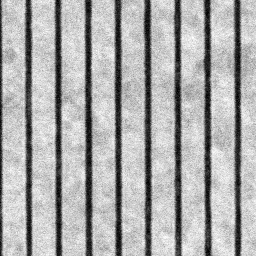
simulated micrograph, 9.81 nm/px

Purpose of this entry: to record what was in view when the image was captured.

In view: parallel lines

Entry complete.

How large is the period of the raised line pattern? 293 nm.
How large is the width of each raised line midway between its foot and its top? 213 nm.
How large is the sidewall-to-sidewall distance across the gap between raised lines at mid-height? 79.7 nm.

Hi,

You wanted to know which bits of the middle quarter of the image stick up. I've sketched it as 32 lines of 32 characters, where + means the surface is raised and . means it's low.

+++++..+++++...+++++..+++++...++
+++++..+++++...+++++..+++++...++
+++++..+++++...+++++..+++++...++
+++++..+++++...+++++..+++++...++
+++++..+++++...+++++..+++++...++
+++++..+++++...+++++..+++++...++
+++++..+++++...+++++..+++++...++
+++++..+++++...+++++..+++++...++
+++++..+++++...+++++..+++++...++
+++++..+++++...+++++..+++++...++
+++++..+++++...+++++..+++++...++
+++++..++++++..+++++..+++++...++
+++++..++++++..+++++..+++++...++
+++++..++++++..+++++..+++++...++
+++++..++++++..+++++..+++++...++
+++++..++++++..+++++..+++++...++
+++++..++++++..+++++..+++++...++
+++++..++++++..+++++..+++++...++
+++++..++++++..+++++..+++++...++
+++++..++++++..+++++..+++++...++
+++++..++++++..+++++..+++++...++
+++++..++++++..+++++..+++++...++
+++++..++++++..+++++..+++++...++
+++++..++++++..+++++..+++++...++
+++++..++++++..+++++..+++++...++
+++++..++++++..+++++..+++++...++
+++++..++++++..+++++..+++++...++
+++++..++++++..+++++..+++++...++
+++++..++++++..+++++..+++++...++
+++++..++++++..+++++..+++++...++
+++++..++++++..+++++..+++++...++
+++++..++++++..+++++..+++++...++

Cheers